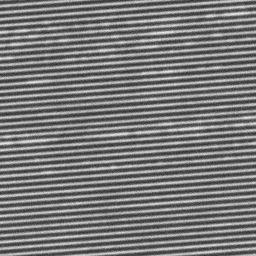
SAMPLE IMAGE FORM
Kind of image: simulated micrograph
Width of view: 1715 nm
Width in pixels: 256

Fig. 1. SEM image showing parallel lines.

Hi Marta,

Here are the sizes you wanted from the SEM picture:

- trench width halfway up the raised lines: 33.4 nm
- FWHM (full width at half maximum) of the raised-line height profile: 10.9 nm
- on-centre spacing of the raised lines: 6.54 px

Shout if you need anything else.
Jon